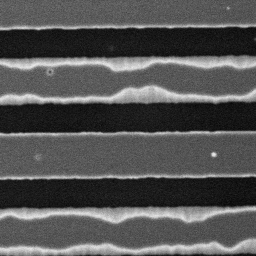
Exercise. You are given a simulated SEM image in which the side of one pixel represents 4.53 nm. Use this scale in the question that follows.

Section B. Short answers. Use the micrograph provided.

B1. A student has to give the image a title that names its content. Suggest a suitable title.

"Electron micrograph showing lines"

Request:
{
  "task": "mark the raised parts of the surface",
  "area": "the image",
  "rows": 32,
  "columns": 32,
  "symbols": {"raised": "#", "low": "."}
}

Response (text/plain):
################################
################################
################################
##########......................
................................
................................
................................
..................#####.....#..#
################################
################################
################################
################################
###############..........###....
................................
................................
................................
...............#....#.##########
################################
################################
################################
################################
################################
................................
................................
................................
................................
##...########..########..#######
################################
################################
################################
################################
#########.....#####.........#...